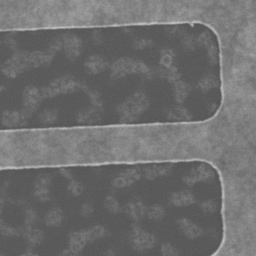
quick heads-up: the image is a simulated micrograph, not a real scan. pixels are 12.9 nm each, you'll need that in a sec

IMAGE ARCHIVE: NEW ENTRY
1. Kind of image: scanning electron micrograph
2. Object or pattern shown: one or a few lines or trenches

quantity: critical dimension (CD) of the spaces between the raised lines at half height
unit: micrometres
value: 1.3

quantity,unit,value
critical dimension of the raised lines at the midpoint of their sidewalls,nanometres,484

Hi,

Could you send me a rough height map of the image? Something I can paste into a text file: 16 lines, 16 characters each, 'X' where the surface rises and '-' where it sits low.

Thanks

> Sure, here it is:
XXXXXXXXXXXXXXXX
XXXXXXXXX----XXX
--------------XX
--------------XX
--------------XX
--------------XX
--------------XX
-------------XXX
XXXXXXXXXXXXXXXX
XXXXXXXXXXXXXXXX
X------------XXX
--------------XX
--------------XX
--------------XX
--------------XX
--------------XX